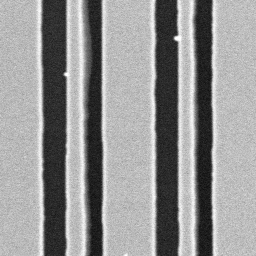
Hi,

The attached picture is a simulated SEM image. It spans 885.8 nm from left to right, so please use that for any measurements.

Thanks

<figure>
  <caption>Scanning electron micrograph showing lines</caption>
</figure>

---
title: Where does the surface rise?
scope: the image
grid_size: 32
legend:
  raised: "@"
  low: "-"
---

@@@@@---@@---@@@@@@---@@---@@@@@
@@@@@---@@@--@@@@@@---@@---@@@@@
@@@@@---@@@--@@@@@@---@@---@@@@@
@@@@@---@@@--@@@@@@---@@---@@@@@
@@@@@---@@@--@@@@@@---@@---@@@@@
@@@@@---@@@--@@@@@@---@@---@@@@@
@@@@@---@@@--@@@@@@---@@---@@@@@
@@@@@---@@@--@@@@@@---@@---@@@@@
@@@@@---@@@--@@@@@@---@@---@@@@@
@@@@@---@@@--@@@@@@---@@---@@@@@
@@@@@---@@@--@@@@@@---@@---@@@@@
@@@@@---@@@--@@@@@@---@@---@@@@@
@@@@@---@@@--@@@@@@---@@---@@@@@
@@@@@---@@@--@@@@@@---@@---@@@@@
@@@@@---@@@--@@@@@@---@@---@@@@@
@@@@@---@@@--@@@@@@---@@---@@@@@
@@@@@---@@@--@@@@@@---@@@--@@@@@
@@@@@---@@@--@@@@@@---@@@--@@@@@
@@@@@---@@@--@@@@@@---@@---@@@@@
@@@@@---@@@--@@@@@@---@@---@@@@@
@@@@@---@@@--@@@@@@---@@---@@@@@
@@@@@---@@@--@@@@@@---@@---@@@@@
@@@@@---@@@--@@@@@@---@@@--@@@@@
@@@@@---@@@--@@@@@@---@@@--@@@@@
@@@@@---@@@--@@@@@@---@@@--@@@@@
@@@@@---@@@--@@@@@@---@@@--@@@@@
@@@@@---@@@--@@@@@@---@@@--@@@@@
@@@@@---@@@--@@@@@@---@@@--@@@@@
@@@@@---@@@--@@@@@@---@@@--@@@@@
@@@@@---@@@--@@@@@@---@@@--@@@@@
@@@@@---@@@--@@@@@@---@@@--@@@@@
@@@@@---@@@--@@@@@@---@@@--@@@@@